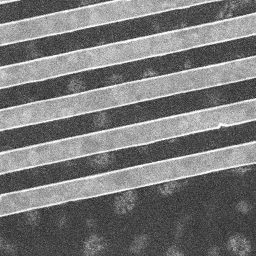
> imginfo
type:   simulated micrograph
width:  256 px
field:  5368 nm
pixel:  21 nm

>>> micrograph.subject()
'parallel lines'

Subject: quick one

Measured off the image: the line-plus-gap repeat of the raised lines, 0.874 micrometres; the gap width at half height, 457 nm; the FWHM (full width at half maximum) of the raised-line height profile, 418 nm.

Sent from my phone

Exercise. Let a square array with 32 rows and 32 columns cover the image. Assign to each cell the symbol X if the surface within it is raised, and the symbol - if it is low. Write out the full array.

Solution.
------------XXXXXXXXXXXXX-------
--------XXXXXXXXXXXX------------
---XXXXXXXXXXXX-------------XXXX
XXXXXXXXXX--------------XXXXXXXX
XXXXXX-------------XXXXXXXXXXXX-
X-------------XXXXXXXXXXXX------
---------XXXXXXXXXXXXX----------
-----XXXXXXXXXXXX-------------XX
XXXXXXXXXXXX-------------XXXXXXX
XXXXXXX-------------XXXXXXXXXXXX
XX-------------XXXXXXXXXXXXX----
-----------XXXXXXXXXXXX---------
------XXXXXXXXXXXX-------------X
-XXXXXXXXXXXXX-------------XXXXX
XXXXXXXXX-------------XXXXXXXXXX
XXXX-------------XXXXXXXXXXXX---
------------XXXXXXXXXXXX--------
--------XXXXXXXXXXXX------------
---XXXXXXXXXXXXX------------XXXX
XXXXXXXXXX-------------XXXXXXXXX
XXXXX--------------XXXXXXXXXXXX-
X-------------XXXXXXXXXXXX------
---------XXXXXXXXXXXX-----------
----XXXXXXXXXXXXX---------------
XXXXXXXXXXXX--------------------
XXXXXXX-------------------------
XX------------------------------
--------------------------------
--------------------------------
--------------------------------
--------------------------------
--------------------------------